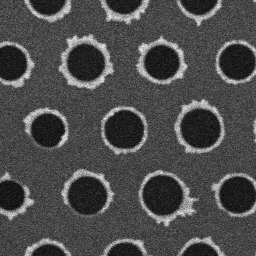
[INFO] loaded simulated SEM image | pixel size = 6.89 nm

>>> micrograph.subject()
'holes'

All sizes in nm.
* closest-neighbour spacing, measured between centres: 522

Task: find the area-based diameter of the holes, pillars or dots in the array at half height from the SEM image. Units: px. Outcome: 39.3